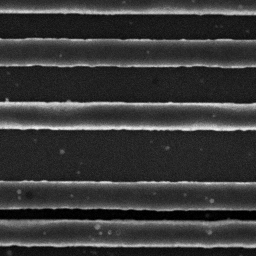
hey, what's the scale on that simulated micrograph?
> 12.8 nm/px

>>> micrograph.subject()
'lines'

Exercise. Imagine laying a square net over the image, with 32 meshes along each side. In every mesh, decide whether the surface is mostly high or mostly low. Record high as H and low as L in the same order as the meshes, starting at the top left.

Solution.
HHHHHHHHHHHHHHHHHHHHHHHHHHHHHHHH
LLHHHHHHHHHHHHHHHHHHHHHHHHHHHHHH
LLLLLLLLLLLLLLLLLLLLLLLLLLLLLLLL
LLLLLLLLLLLLLLLLLLLLLLLLLLLLLLLL
LLLLLLLLLLLLLLLLLLLLLLLLLLLLLLLL
HHHHHHHHHHHHHHHHHHHHHHHHHHHHHHHH
HHHHHHHHHHHHHHHHHHHHHHHHHHHHHHHH
HHHHHHHHHHHHHHHHHHHHHHHHHHHHHHHH
LLLLLLLLLLLLLLLLLLLLLLLLLLLLLLLL
LLLLLLLLLLLLLLLLLLLLLLLLLLLLLLLL
LLLLLLLLLLLLLLLLLLLLLLLLLLLLLLLL
LLLLLLLLLLLLLLLLLLLLLLLLLLLLLLLL
LLLLLLLLLLLLLLLLLLLLLLLLLLLLLLLL
HHHHHHHHHHHHHHHHHHHHHHHHHHHHHHHH
HHHHHHHHHHHHHHHHHHHHHHHHHHHHHHHH
HHHHHHHHHHHHHHHHHHHHHHHHHHHHHHHH
LLLLLLLLLLLLLLLLLLLLLLLLLLLLLLLL
LLLLLLLLLLLLLLLLLLLLLLLLLLLLLLLL
LLLLLLLLLLLLLLLLLLLLLLLLLLLLLLLL
LLLLLLLLLLLLLLLLLLLLLLLLLLLLLLLL
LLLLLLLLLLLLLLLLLLLLLLLLLLLLLLLL
LLLLLLLLLLLLLLLLLLLLLLLLLLLLLLLL
LLLLLLLLLLLLLLLLLLLLLLLLLLLLLLLL
HHHHHHHHHHHHHHHHHHHHHHHHHHHHHHHH
HHHHHHHHHHHHHHHHHHHHHHHHHHHHHHHH
HHHHHHHHHHHHHHHHHHHHHHHHHHHHHHHH
LLLLLLLLLLLLLLLLLLLLLLLLLLLLLLLL
HLLLLHHHHHLLLLLLLLLLLLLLLLLLLLLL
HHHHHHHHHHHHHHHHHHHHHHHHHHHHHHHH
HHHHHHHHHHHHHHHHHHHHHHHHHHHHHHHH
HHHHHHHHHHHHHHHHHHHHHHHHHHHHHHHH
LLLLLLLLLLLLLLLLLLLLLLLLLLLLLLLL